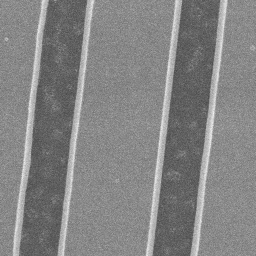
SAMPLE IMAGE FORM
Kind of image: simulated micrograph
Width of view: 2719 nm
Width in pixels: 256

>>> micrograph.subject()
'one or a few lines or trenches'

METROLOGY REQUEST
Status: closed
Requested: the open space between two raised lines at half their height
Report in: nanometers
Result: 483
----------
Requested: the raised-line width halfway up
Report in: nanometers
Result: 931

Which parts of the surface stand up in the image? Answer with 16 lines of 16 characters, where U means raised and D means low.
UUUDDDUUUUUDDDUU
UUUDDDUUUUUDDDUU
UUDDDUUUUUUDDDUU
UUDDDUUUUUUDDDUU
UUDDDUUUUUUDDUUU
UUDDDUUUUUUDDUUU
UUDDDUUUUUDDDUUU
UUDDDUUUUUDDDUUU
UUDDDUUUUUDDDUUU
UUDDDUUUUUDDDUUU
UUDDUUUUUUDDDUUU
UDDDUUUUUUDDDUUU
UDDDUUUUUUDDDUUU
UDDDUUUUUUDDUUUU
UDDDUUUUUUDDUUUU
UDDDUUUUUDDDUUUU